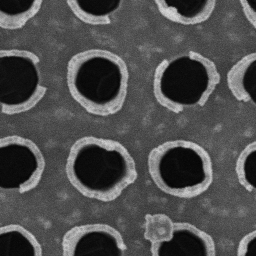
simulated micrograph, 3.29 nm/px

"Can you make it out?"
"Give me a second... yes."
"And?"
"holes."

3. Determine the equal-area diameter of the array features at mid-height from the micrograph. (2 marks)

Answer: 0.15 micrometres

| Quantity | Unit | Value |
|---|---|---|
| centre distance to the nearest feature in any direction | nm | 278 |